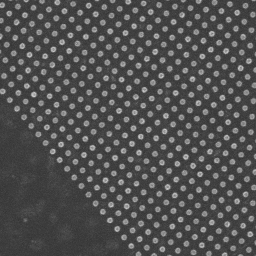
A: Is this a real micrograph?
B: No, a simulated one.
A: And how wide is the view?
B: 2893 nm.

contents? a regular array of raised bodies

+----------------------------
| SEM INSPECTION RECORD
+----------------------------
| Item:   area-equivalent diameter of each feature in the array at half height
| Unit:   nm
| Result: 57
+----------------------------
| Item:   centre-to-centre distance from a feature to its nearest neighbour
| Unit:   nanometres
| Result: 122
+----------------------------